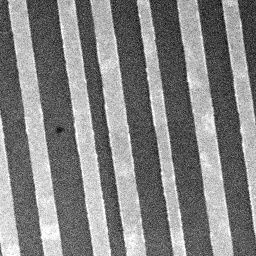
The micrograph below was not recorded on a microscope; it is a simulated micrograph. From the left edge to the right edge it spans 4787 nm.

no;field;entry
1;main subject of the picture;parallel lines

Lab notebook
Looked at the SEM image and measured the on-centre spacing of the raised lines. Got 42.1 px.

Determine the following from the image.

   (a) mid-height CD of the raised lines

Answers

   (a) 319 nm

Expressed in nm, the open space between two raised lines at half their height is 502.